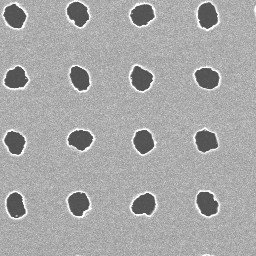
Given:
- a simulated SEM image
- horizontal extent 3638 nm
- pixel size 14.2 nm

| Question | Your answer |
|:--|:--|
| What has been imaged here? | a regular array of holes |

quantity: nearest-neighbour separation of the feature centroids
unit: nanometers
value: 890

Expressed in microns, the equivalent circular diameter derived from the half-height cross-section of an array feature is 0.317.